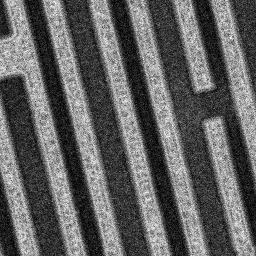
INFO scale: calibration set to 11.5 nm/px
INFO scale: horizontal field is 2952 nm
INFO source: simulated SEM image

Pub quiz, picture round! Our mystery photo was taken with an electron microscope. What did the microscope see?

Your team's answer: parallel lines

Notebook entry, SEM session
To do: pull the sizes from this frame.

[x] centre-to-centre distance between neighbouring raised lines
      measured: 0.472 µm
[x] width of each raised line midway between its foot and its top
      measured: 214 nm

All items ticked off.